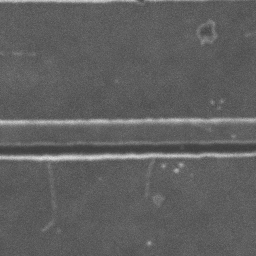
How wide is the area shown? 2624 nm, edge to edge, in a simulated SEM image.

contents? lines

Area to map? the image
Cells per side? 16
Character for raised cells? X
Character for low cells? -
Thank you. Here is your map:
----------------
----------------
----------------
----------------
----------------
----------------
----------------
----------XXXXXX
XXXXXXXXXXXXXXXX
XXXXXXXXXXXXXXXX
----------------
----------------
----------------
----------------
----------------
----------------